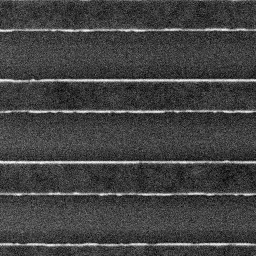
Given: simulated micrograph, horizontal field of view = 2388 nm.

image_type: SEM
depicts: lines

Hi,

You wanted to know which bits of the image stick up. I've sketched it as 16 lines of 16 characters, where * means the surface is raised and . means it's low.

****************
****************
................
................
................
****************
****************
................
................
................
****************
****************
................
................
................
****************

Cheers